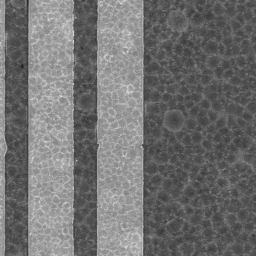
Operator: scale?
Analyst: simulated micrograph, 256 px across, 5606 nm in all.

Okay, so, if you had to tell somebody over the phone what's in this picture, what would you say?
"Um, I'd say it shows one or a few lines or trenches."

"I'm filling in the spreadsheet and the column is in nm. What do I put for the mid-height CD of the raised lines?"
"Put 980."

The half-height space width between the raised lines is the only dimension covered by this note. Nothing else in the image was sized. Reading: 537 nm